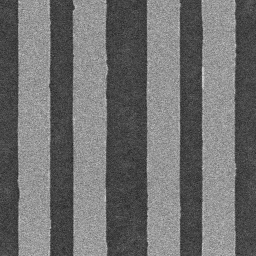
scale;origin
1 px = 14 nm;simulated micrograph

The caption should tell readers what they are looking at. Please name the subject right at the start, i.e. one or a few lines or trenches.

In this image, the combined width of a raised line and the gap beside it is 862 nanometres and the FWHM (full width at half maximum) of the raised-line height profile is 453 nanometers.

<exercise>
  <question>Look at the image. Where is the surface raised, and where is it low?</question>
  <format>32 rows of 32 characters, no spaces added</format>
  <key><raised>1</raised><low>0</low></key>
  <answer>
00111100011110000011110001111000
00111100011110000011110001111000
00111100011110000011110001111000
00111100011110000011110001111000
00111100011110000011110001111000
00111100011110000011110001111000
00111100011110000011110001111000
00111100011110000011110001111000
00111100011110000011110001111000
00111100011110000011110001111000
00111100011110000011110001111000
00111100011110000011110001111000
00111100011110000011110001111000
00111100011110000011110001111000
00111100011110000011110001111000
00111100011110000011110001111000
00111100011110000011110001111000
00111100011110000011110001111000
00111100011110000011110001111000
00111100011110000011110001111000
00111100011110000011110001111000
00111100011110000011110001111000
00111100011110000011110001111000
00111100011110000011110001111000
00111100011110000011110001111000
00111100011110000011111001111000
00111100011110000011111001111000
00111100011110000011111001111000
00111100011110000011110001111000
00111100011110000011110001111000
00111100011110000001110001111000
00111100011110000011110001111000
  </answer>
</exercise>